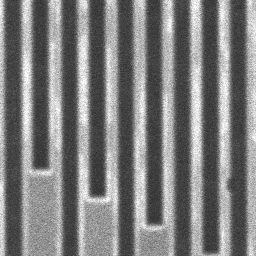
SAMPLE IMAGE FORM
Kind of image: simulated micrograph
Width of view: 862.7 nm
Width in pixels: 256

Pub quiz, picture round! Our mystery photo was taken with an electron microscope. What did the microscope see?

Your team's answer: parallel lines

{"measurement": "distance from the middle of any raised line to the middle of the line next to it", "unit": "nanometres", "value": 94.9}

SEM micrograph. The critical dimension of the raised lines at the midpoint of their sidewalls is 0.0408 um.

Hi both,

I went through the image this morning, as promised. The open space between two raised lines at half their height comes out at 52.4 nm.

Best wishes